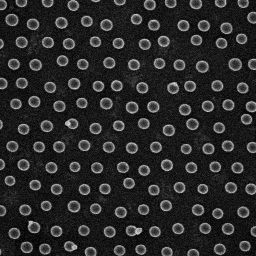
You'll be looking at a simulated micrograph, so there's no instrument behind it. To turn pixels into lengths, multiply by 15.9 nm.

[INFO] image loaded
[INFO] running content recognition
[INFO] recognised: a regular array of raised bodies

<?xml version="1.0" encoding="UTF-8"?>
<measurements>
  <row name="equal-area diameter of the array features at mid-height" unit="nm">176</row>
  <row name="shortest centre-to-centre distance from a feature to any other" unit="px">20.4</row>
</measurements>